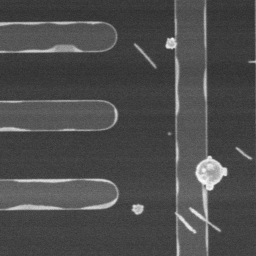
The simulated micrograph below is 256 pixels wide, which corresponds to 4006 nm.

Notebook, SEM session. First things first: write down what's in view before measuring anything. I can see groups of lines, slits or small figures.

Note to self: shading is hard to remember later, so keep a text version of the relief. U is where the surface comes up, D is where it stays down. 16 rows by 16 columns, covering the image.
DDDDDDDDDDDUUDDD
UUUUUUUDDDDUUDDD
UUUUUUUDDDDUUDDD
DDDDDDDDDDDUUDDD
DDDDDDDDDDDUUDDD
DDDDDDDDDDDUUDDD
UUUUUUUDDDDUUDDD
UUUUUUUDDDDUUDDD
DDDDDDDDDDDUUDDD
DDDDDDDDDDDUUDDD
DDDDDDDDDDDUUUDD
UUUUUUUDDDDUUDDD
UUUUUUUDDDDUUDDD
DDDDDDDDDDDUUDDD
DDDDDDDDDDDUUDDD
DDDDDDDDDDDUUDDD